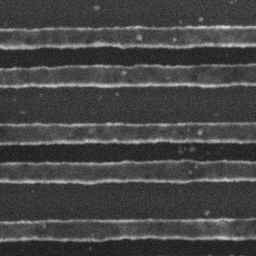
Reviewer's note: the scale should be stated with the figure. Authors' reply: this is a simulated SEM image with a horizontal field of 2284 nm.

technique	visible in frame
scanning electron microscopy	lines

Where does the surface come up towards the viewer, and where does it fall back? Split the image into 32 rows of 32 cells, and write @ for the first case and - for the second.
--------------------------------
--------------------------------
--------------------------------
--------------@@@@@@-@@@@@@@@@@@
@@@@@@@@@@@@@@@@@@@@@@@@@@@@@@@@
@@@@@@@@@@@@@@@@@@@@@@@@@@@@@@@@
--------------------------------
--------------------------------
----@@-@@@@@@@@@@@@@@@@@@@@@@@@@
@@@@@@@@@@@@@@@@@@@@@@@@@@@@@@@@
@@@@@@@@@@@@@@@@@@@@@@@@@@@@@@@@
--------------------------------
--------------------------------
--------------------------------
--------------------------------
----@--------@@@------@@@@@@@@@@
@@@@@@@@@@@@@@@@@@@@@@@@@@@@@@@@
@@@@@@@@@@@@@@@@@@@@@@@@@@@@@@@@
--------------------------------
--------------------------------
@@@@@@@@@@@@@@@@@@@@@@@@@@@@@@@@
@@@@@@@@@@@@@@@@@@@@@@@@@@@@@@@@
@@@@@@@@@@@@@@@@@@@@@@@@@@@@@@@@
--------------------------------
--------------------------------
--------------------------------
--------------------------------
------------------@@----@@@@@@@@
@@@@@@@@@@@@@@@@@@@@@@@@@@@@@@@@
@@@@@@@@@@@@@@@@@@@@@@@@@@@@@@@@
--------------------------------
--------------------------------